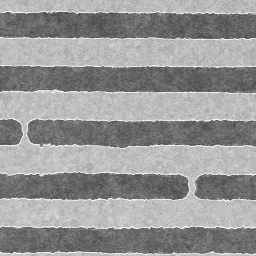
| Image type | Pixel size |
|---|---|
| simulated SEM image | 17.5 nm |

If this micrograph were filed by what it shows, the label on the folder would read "parallel lines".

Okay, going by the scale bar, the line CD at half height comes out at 489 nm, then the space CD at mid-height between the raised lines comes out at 448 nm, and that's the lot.